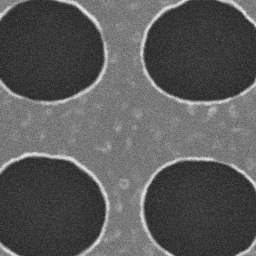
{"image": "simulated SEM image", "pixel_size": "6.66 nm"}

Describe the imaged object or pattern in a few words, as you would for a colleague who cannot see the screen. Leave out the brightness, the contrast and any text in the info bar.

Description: holes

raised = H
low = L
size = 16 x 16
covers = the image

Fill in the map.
HLLLLHHHHHHLLLLH
LLLLLLHHHHLLLLLL
LLLLLLHHHLLLLLLL
LLLLLLLHHLLLLLLL
LLLLLLHHHLLLLLLL
LLLLLHHHHHLLLLLH
HHHHHHHHHHHHHHHH
HHHHHHHHHHHHHHHH
HHHHHHHHHHHHHHHH
HHHHHHHHHHHHHHHH
LLLLLHHHHHLLLLLH
LLLLLLHHHLLLLLLL
LLLLLLLHHLLLLLLL
LLLLLLLHHLLLLLLL
LLLLLLHHHLLLLLLL
LLLLLLHHHHLLLLLH